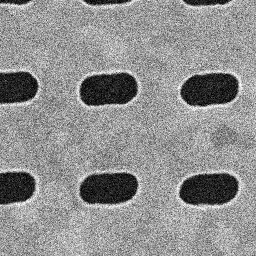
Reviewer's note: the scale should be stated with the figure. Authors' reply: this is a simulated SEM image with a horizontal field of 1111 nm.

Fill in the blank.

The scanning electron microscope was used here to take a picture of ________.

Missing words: holes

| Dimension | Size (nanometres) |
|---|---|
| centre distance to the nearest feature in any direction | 432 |